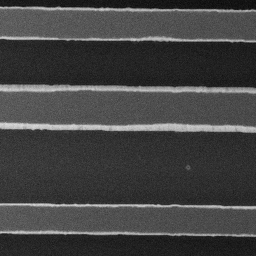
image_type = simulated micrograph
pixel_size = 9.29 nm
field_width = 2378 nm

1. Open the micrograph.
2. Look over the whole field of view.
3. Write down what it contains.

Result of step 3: lines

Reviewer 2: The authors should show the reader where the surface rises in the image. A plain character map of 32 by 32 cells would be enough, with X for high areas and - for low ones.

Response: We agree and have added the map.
--------------------------------
XXXXXXXXXXXXXXXXXXXXXXXXXXXXXXXX
XXXXXXXXXXXXXXXXXXXXXXXXXXXXXXXX
XXXXXXXXXXXXXXXXXXXXXXXXXXXXXXXX
XXXXXXXXXXXXXXXXXXXXXXXXXXXXXXXX
--------------------------------
--------------------------------
--------------------------------
--------------------------------
--------------------------------
--------------------------------
XXXXXXXXXXXXXXXXXXXXXXXXXXXXXXXX
XXXXXXXXXXXXXXXXXXXXXXXXXXXXXXXX
XXXXXXXXXXXXXXXXXXXXXXXXXXXXXXXX
XXXXXXXXXXXXXXXXXXXXXXXXXXXXXXXX
XXXXXXXXXXXXXXXXXXXXXXXXXXXXXXXX
--------------------------------
--------------------------------
--------------------------------
--------------------------------
--------------------------------
--------------------------------
--------------------------------
--------------------------------
--------------------------------
--------------------------------
XXXXXXXXXXXXXXXXXXXXXXXXXXXXXXXX
XXXXXXXXXXXXXXXXXXXXXXXXXXXXXXXX
XXXXXXXXXXXXXXXXXXXXXXXXXXXXXXXX
-----------------------------XXX
--------------------------------
--------------------------------